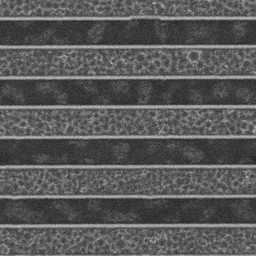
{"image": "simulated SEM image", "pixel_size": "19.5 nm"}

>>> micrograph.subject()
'parallel lines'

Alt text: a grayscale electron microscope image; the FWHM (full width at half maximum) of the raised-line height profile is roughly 594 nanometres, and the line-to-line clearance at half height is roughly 558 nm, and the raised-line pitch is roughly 1160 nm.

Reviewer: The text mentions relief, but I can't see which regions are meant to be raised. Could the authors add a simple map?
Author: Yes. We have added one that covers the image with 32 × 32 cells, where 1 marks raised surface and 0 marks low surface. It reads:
11111111111111111111111111111111
11111111111111111111111111111111
00000000000000000000000000000000
00000000000000000000000000000000
00000000000000000000000000000000
00000000000000000000000000000000
11111111111111111111111111111111
11111111111111111111111111111111
11111111111111111111111111111111
11111111111111111111111111111111
00000000000000000000000000000000
00000000000000000000000000000000
00000000000000000000000000000000
11111111111111111111111111111111
11111111111111111111111111111111
11111111111111111111111111111111
11111111111111111111111111111111
00000000000000000000000000000000
00000000000000000000000000000000
00000000000000000000000000000000
00000000000000000000000000000000
11111111111111111111111111111111
11111111111111111111111111111111
11111111111111111111111111111111
11111111111111111111100000000000
00000000000000000000000000000000
00000000000000000000000000000000
00000000000000000000000000000000
11111111111111111111111111111111
11111111111111111111111111111111
11111111111111111111111111111111
11111111111111111111111111111111